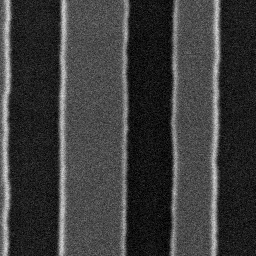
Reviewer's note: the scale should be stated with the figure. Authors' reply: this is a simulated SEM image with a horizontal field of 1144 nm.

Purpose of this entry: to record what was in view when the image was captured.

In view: lines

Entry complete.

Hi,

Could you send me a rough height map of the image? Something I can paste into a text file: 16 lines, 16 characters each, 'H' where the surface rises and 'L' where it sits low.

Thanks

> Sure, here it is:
HLLLHHHHLLLHHHLL
LLLLHHHHLLLHHHLL
LLLLHHHHLLLHHHLL
LLLLHHHHLLLHHHLL
HLLLHHHHLLLHHHLL
LLLLHHHHLLLHHHLL
LLLLHHHHLLLHHHLL
LLLLHHHHLLLHHHLL
LLLLHHHHLLLHHHLL
LLLLHHHHLLLHHLLL
LLLLHHHHLLLHHLLL
LLLLHHHHLLLHHLLL
LLLLHHHHLLLHHLLL
LLLLHHHHLLLHHLLL
LLLLHHHHLLLHHLLL
LLLLHHHHLLLHHLLL